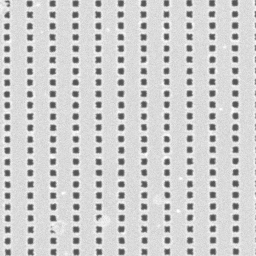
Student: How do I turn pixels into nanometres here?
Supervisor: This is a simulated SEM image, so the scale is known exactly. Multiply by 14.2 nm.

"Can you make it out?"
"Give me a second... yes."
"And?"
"a regular array of holes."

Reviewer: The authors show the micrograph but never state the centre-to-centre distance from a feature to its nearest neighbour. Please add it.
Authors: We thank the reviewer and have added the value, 157 nanometres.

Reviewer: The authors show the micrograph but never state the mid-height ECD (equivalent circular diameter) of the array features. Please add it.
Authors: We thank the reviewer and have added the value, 105 nm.